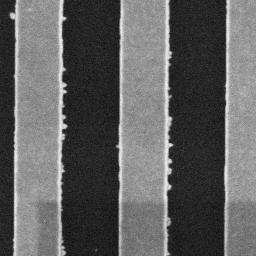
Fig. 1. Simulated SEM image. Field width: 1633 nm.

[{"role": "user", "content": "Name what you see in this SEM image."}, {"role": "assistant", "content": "lines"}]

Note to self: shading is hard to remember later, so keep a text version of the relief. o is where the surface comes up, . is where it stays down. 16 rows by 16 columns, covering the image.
.ooo....ooo...oo
.ooo....ooo...oo
.ooo....ooo...oo
.ooo....oo....oo
.ooo....oo....oo
.ooo....oo....oo
.ooo....oo....oo
.ooo...ooo....oo
.ooo...ooo....oo
.ooo...ooo....oo
.ooo...ooo....oo
.ooo...ooo....oo
.ooo...ooo....oo
.ooo...ooo....oo
.ooo...ooo....oo
.ooo...ooo....oo